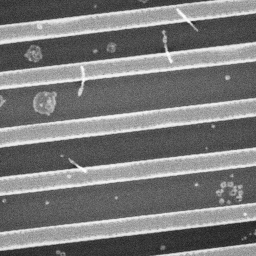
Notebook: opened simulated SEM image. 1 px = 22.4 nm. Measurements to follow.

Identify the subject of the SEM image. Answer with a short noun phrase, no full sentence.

lines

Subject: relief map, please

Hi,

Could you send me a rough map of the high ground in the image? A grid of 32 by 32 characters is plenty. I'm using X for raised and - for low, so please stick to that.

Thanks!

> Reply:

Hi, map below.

-----------------------XXXXXXXXX
--------------XXXXXXXXXXXXXXXXXX
------XXXXXXXXXXXXXXXXXXX-------
XXXXXXXXXXXXXXXXX---------------
XXXXXXXXX-----------------------
------------------------------XX
---------------------XXXXXXXXXXX
-------------XXXXXXXXXXXXXXXXXXX
----XXXXXXXXXXXXXXXXXXXX--------
XXXXXXXXXXXXXXX-----------------
XXXXXX--------------------------
--------------------------------
-------------------------------X
---------------------XXXXXXXXXXX
-------------XXXXXXXXXXXXXXXXXXX
-----XXXXXXXXXXXXXXXXXXX--------
XXXXXXXXXXXXXXXX----------------
XXXXXXXX------------------------
--------------------------------
-----------------------XXXXXXXXX
--------------XXXXXXXXXXXXXXXXXX
------XXXXXXXXXXXXXXXXXXX-------
XXXXXXXXXXXXXXXXX---------------
XXXXXXXX------------------------
--------------------------------
-------------------------------X
----------------------XXXXXXXXXX
-------------XXXXXXXXXXXXXXXXXXX
-----XXXXXXXXXXXXXXXXXXX--------
XXXXXXXXXXXXXXXX----------------
XXXXXXX-------------------------
------------------------XXXXXXXX